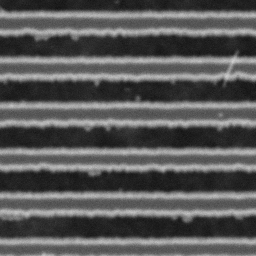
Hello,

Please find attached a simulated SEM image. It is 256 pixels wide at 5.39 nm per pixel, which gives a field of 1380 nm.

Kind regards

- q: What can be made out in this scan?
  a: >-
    lines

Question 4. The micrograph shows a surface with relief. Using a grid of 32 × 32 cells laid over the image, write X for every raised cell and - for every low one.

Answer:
--------------------------------
X-------------------------------
XXXXXXXXXXXXXXXXXXXXXXXXXXXXXXXX
XXXXXXXXXXXXXXXXXXXXXXXXXXXXXXXX
--------------------------------
--------------------------------
--------------------------------
XXXXXXXXXXXXXXXXXXXXXXXXXXXXXXXX
XXXXXXXXXXXXXXXXXXXXXXXXXXXXXXXX
XXXXXXXXXXXXXXXXXXXXXXXXXXXXXXXX
--------------------------------
--------------------------------
--------------------------------
XXXXXXXXXXXXXXXXXXXXXXXXXXXXXXXX
XXXXXXXXXXXXXXXXXXXXXXXXXXXXXXXX
XXXXXXXXXXXXXXXXXXXXXXXXXXXXXXXX
--------------------------------
--------------------------------
--------------------------------
XXXXXXXXXXXXXXXXXXXXXXXXXXXXXXXX
XXXXXXXXXXXXXXXXXXXXXXXXXXXXXXXX
--------------------------------
--------------------------------
--------------------------------
XXXXXXXXXXXXXXXXXXXXXXXXXXXXXXXX
XXXXXXXXXXXXXXXXXXXXXXXXXXXXXXXX
XXXXXXXXXXXXXXXXXXXXXXXXXXXXXXXX
--------------------------------
--------------------------------
--------------------------------
XXXXXXXXXXXXXXXXXXXXXXXXXXXXXXXX
XXXXXXXXXXXXXXXXXXXXXXXXXXXXXXXX